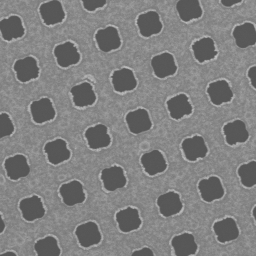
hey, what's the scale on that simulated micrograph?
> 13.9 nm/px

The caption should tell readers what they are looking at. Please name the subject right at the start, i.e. a regular array of holes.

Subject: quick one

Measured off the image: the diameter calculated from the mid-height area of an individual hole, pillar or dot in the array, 344 nm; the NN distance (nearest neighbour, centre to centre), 601 nm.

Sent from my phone